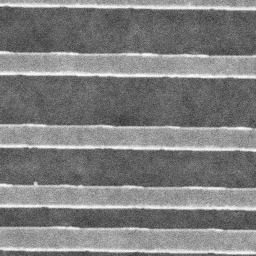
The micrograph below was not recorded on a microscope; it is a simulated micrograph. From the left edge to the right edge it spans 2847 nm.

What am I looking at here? lines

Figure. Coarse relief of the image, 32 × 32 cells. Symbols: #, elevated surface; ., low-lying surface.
################################
................................
................................
................................
................................
................................
................................
################################
################################
........................########
................................
................................
................................
................................
................................
................................
################################
################################
................################
................................
................................
................................
................................
##################..............
################################
################################
................................
................................
................................
################################
################################
............................####